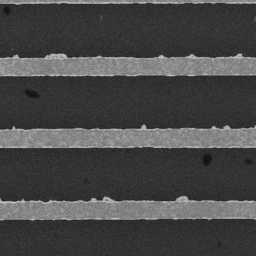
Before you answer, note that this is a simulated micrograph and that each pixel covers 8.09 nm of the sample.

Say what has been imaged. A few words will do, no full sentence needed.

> lines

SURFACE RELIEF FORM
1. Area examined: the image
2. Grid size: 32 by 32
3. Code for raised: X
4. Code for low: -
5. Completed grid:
--------------------------------
--------------------------------
--------------------------------
--------------------------------
--------------------------------
--------------------------------
--------------------------------
XXXXXXXXXXXXXXXXXXXXXXXXXXXXXXXX
XXXXXXXXXXXXXXXXXXXXXXXXXXXXXXXX
--------------------------------
--------------------------------
--------------------------------
--------------------------------
--------------------------------
--------------------------------
--------------------------------
XXXXXXXXXXXXXXXXXXXXXXXXXXXXXXXX
XXXXXXXXXXXXXXXXXXXXXXXXXXXXXXXX
--------------------------------
--------------------------------
--------------------------------
--------------------------------
--------------------------------
--------------------------------
--------------------------------
XXXXXXXXXXXXXXXXXXXXXXXXXXXXXXXX
XXXXXXXXXXXXXXXXXXXXXXXXXXXXXXXX
--------------------------------
--------------------------------
--------------------------------
--------------------------------
--------------------------------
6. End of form